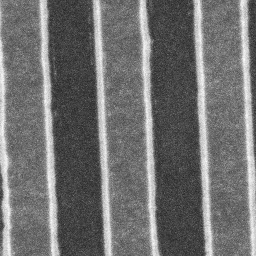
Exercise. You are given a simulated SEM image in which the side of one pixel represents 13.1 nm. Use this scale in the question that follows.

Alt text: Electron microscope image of one or a few lines or trenches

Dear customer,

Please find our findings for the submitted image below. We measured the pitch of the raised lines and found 1310 nm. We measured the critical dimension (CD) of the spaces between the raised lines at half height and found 698 nm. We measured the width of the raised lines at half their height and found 617 nm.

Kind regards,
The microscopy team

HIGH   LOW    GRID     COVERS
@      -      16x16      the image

@@@---@@@---@@@-
@@@---@@@---@@@-
@@@---@@@---@@@-
@@@---@@@---@@@-
@@@---@@@----@@-
@@@---@@@----@@-
@@@---@@@----@@@
@@@---@@@----@@@
@@@---@@@----@@@
@@@---@@@----@@@
@@@----@@----@@@
@@@----@@----@@@
@@@----@@----@@@
@@@----@@@---@@@
@@@----@@@---@@@
@@@----@@@---@@@